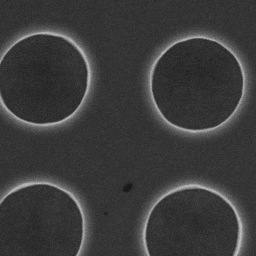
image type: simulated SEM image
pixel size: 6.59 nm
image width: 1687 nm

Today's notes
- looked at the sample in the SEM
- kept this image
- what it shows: holes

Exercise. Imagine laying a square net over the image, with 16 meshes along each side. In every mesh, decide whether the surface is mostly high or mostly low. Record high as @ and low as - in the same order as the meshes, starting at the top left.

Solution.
@@@@@@@@@@@@@@@@
@@@@@@@@@@@@@@@@
@---@@@@@@@@-@@@
-----@@@@@-----@
-----@@@@@-----@
-----@@@@------@
-----@@@@@-----@
@@--@@@@@@----@@
@@@@@@@@@@@@@@@@
@@@@@@@@@@@@@@@@
@@@@@@@@@@@@@@@@
@@@@@@@@@@@@@@@@
-----@@@@@----@@
-----@@@@------@
-----@@@@------@
-----@@@@------@